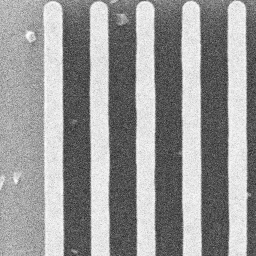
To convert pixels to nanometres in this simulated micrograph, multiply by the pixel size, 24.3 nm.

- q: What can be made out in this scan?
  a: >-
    groups of lines, slits or small figures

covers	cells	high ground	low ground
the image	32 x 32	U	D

DDDDDDUDDDDDUDDDDUUDDDDUUDDDDUDD
DDDDDDUUDDDUUDDDDUUDDDDUUDDDDUUD
DDDDDDUUDDDUUDDDDUUDDDDUUDDDDUUD
DDDDDDUUDDDUUDDDDUUDDDDUUDDDDUUD
DDDDDDUUDDDUUDDDDUUDDDDUUDDDDUUD
DDDDDDUUDDDUUDDDDUUDDDDUUDDDDUUD
DDDDDDUUDDDUUDDDDUUDDDDUUDDDDUUD
DDDDDDUUDDDUUUDDDUUDDDDUUDDDDUUD
DDDDDDUUDDDUUUDDDUUDDDDUUDDDDUUD
DDDDDDUUDDDUUUDDDUUDDDDUUDDDDUUD
DDDDDDUUDDDUUDDDDUUDDDDUUDDDDUUD
DDDDDDUUDDDUUDDDDUUDDDDUUDDDDUUD
DDDDDDUUDDDUUDDDDUUDDDDUUDDDDUUD
DDDDDDUUDDDUUDDDDUUDDDDUUDDDDUUD
DDDDDDUUDDDUUDDDDUUDDDDUUDDDDUUD
DDDDDDUUDDDUUUDDDUUDDDDUUDDDDUUD
DDDDDDUUDDDUUUDDDUUDDDDUUDDDDUUD
DDDDDDUUDDDUUUDDDUUDDDDUUDDDDUUD
DDDDDDUUDDDUUUDDDUUDDDDUUDDDDUUD
DDDDDDUUDDDUUUDDDUUDDDDUUDDDDUUD
DDDDDDUUDDDUUUDDDUUDDDDUUDDDDUUD
DDDDDDUUDDDUUUDDDUUDDDDUUDDDDUUD
DDDDDDUUDDDUUUDDDUUDDDDUUDDDDUUD
DDDDDDUUDDDUUUDDDUUDDDDUUDDDDUUD
DDDDDDUUDDDUUUDDDUUDDDDUUDDDDUUD
DDDDDDUUDDDUUUDDDUUDDDDUUDDDDUUD
DDDDDDUUDDDUUUDDDUUDDDDUUDDDDUUD
DDDDDDUUDDDUUUDDDUUDDDDUUDDDDUUD
DDDDDDUUDDDUUUDDDUUDDDDUUDDDDUUD
DDDDDDUUDDDUUUDDDUUDDDDUUDDDDUUD
DDDDDDUUDDDDUUDDDUUDDDDUUDDDDUUD
DDDDDDUUDDDDUUDDDUUDDDDUUDDDDUUD